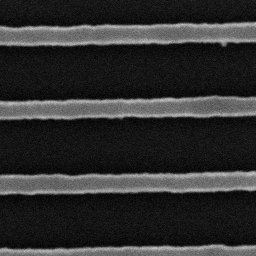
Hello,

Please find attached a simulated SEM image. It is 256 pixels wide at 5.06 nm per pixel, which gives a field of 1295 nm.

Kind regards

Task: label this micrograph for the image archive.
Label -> lines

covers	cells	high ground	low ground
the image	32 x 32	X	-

--------------------------------
--------------------------------
--------------------------------
XXXXXXXXXXXXXXXXXXXXXXXXXXXXXXXX
XXXXXXXXXXXXXXXXXXXXXXXXXXXXXXXX
XXXXXXXXXXX---------------------
--------------------------------
--------------------------------
--------------------------------
--------------------------------
--------------------------------
--------------------------------
-------------------XXXXXXXXXXXXX
XXXXXXXXXXXXXXXXXXXXXXXXXXXXXXXX
XXXXXXXXXXXXXXXXXXXXXXXXXXXX----
--------------------------------
--------------------------------
--------------------------------
--------------------------------
--------------------------------
--------------------------------
--------------------------------
XXXXXXXXXXXXXXXXXXXXXXXXXXXXXXXX
XXXXXXXXXXXXXXXXXXXXXXXXXXXXXXXX
--------------------------------
--------------------------------
--------------------------------
--------------------------------
--------------------------------
--------------------------------
--------------------------------
XXXXXXXXXXXXXXXXXXXXXXXXXXXXXXXX